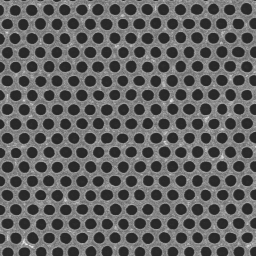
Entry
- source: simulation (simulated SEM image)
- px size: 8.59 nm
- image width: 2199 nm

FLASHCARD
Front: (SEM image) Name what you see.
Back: a regular array of holes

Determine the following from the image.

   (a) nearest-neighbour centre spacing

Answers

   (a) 138 nanometres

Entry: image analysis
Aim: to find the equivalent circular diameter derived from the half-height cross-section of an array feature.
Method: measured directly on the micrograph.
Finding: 0.0954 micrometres